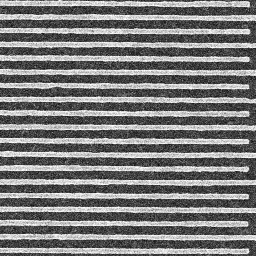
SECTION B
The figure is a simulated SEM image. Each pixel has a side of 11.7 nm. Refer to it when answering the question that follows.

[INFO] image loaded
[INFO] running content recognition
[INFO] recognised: parallel lines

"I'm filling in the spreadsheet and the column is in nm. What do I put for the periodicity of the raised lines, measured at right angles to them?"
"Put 161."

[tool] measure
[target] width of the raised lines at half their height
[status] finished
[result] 55.7 nm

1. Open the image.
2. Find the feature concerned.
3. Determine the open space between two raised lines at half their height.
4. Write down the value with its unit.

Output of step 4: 107 nanometres